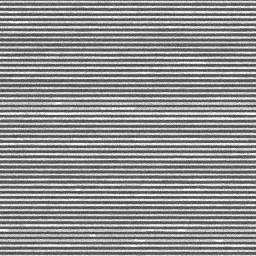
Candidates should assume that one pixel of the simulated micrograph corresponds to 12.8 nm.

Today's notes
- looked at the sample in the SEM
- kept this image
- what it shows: parallel lines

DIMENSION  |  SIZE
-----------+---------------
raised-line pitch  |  65 nm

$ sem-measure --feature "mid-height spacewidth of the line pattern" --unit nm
38.4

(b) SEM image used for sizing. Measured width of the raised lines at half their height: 0.0256 µm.